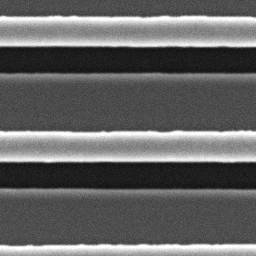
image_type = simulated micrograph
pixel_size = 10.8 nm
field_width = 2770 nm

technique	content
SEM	lines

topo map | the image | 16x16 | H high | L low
HHHHHHHHHHHHHHHH
HHHHHHHHHHHHHHHH
HHHHHHHHHHHHHHHH
LLLLLLLLLLLLLLLL
LLLLLLLLLLLLLLLL
HHHHHHHHHHHHHHHH
HHHHHHHHHHHHHHHH
HHHHHHHHHHHHHHHH
HHHHHHHHHHHHHHHH
HHHHHHHHHHHHHHHH
LLLLLLLLLLLLLLLL
LLLLLLLLLLLLLLLL
HHHHHHHHHHHHHHHH
HHHHHHHHHHHHHHHH
HHHHHHHHHHHHHHHH
HHHHHHHHHHHHHHHH